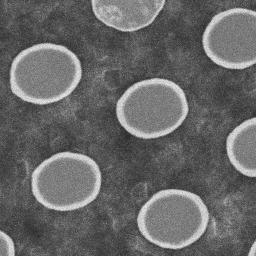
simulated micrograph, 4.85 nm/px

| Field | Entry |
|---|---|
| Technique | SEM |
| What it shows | raised bodies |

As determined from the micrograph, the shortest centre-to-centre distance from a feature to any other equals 111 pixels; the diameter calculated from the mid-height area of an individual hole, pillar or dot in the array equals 60.2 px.